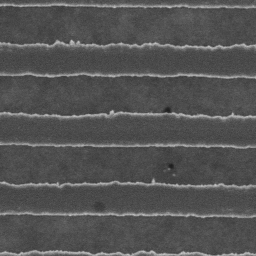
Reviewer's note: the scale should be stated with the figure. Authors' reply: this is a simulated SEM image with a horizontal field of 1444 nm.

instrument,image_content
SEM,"lines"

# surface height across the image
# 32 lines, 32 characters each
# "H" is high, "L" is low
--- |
HHHHHHHHHHHHHHHHHHHHHHHHHHHHHHHH
LLLLLLLLLLLLLLLLLLLLLLLLLLLLLLLL
LLLLLLLLLLLLLLLLLLLLLLLLLLLLLLLL
LLLLLLLLLLLLLLLLLLLLLLLLLLLLLLLL
LLLLLLLLLLLLLLLLLLLLLLLLLLLLLLLL
HLLLHLLHHHLLLLLLLLHHLLLLLLLLLLLL
HHHHHHHHHHHHHHHHHHHHHHHHHHHHHHHH
HHHHHHHHHHHHHHHHHHHHHHHHHHHHHHHH
HHHHHHHHHHHHHHHHHHHHHHHHHHHHHHHH
LLLLHHHHHLLHHHHLLHLHHHLHHHHHHHHH
LLLLLLLLLLLLLLLLLLLLLLLLLLLLLLLL
LLLLLLLLLLLLLLLLLLLLLLLLLLLLLLLL
LLLLLLLLLLLLLLLLLLLLLLLLLLLLLLLL
LLLLLLLLLLLLLLLLLLLLLLLLLLLLLLLL
HHHHHHHHLHHHHHHHHHHHHHHHHHLLLHLL
HHHHHHHHHHHHHHHHHHHHHHHHHHHHHHHH
HHHHHHHHHHHHHHHHHHHHHHHHHHHHHHHH
HHHHHHHHHHHHHHHHHHHHHHHHHHHHHHHH
LLLLLLLLLLLLLLLLLLLLLLLLLLLLLLLL
LLLLLLLLLLLLLLLLLLLLLLLLLLLLLLLL
LLLLLLLLLLLLLLLLLLLLLLLLLLLLLLLL
LLLLLLLLLLLLLLLLLLLLLLLLLLLLLLLL
LLLLLLLLLLLLLLLLLLLLLLLLLLLLLLLL
HHHHHHHHHHHHHHHHHHHHHHHHHHHHHHHH
HHHHHHHHHHHHHHHHHHHHHHHHHHHHHHHH
HHHHHHHHHHHHHHHHHHHHHHHHHHHHHHHH
HHHHHHHHHHHHHHHHHHHHHHHHHHHHHHHH
LLLLLLLLLLLLLLLLLLLLLLLLLLLLLLLL
LLLLLLLLLLLLLLLLLLLLLLLLLLLLLLLL
LLLLLLLLLLLLLLLLLLLLLLLLLLLLLLLL
LLLLLLLLLLLLLLLLLLLLLLLLLLLLLLLL
LLLHHHHHHLHLLLLLLHHLLLLLLLLLLLLL